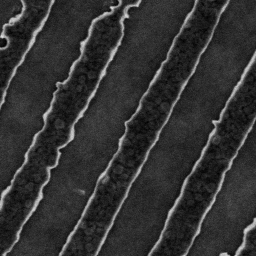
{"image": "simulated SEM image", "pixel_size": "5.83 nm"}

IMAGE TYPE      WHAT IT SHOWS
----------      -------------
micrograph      one or a few lines or trenches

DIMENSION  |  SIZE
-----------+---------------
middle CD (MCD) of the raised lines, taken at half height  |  0.181 µm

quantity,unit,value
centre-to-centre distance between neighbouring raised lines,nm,453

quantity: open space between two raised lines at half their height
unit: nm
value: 272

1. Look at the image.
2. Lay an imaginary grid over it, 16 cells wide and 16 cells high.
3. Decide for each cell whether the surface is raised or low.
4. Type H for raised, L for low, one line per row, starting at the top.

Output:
LHHLLLLHLLLLHHLL
HHHLLLHHLLLHHHLL
HHLLLHHHLLLHHLLL
HHLLLHHLLLHHHLLL
HLLLHHHLLLHHLLLH
LLLLHHLLLHHLLLLH
LLLHHLLLLHHLLLHH
LLLHHLLLHHLLLLHH
LLHHLLLLHHLLLHHL
LLHHLLLHHLLLLHHL
LHHLLLLHHLLLHHLL
LHHLLLHHLLLLHHLL
HHLLLLHHLLLHHLLL
HHLLLHHLLLLHHLLL
HLLLLHHLLLHHLLLH
HLLLHHLLLLHHLLLH